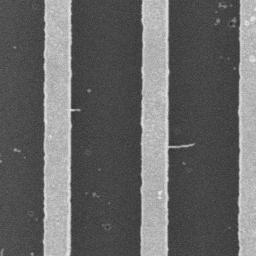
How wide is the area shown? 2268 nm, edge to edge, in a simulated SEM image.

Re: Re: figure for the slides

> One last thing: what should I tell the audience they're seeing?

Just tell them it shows lines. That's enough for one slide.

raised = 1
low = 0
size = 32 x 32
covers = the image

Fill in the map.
00000011100000000011100000000011
00000011100000000011100000000011
00000011100000000011100000000011
00000011100000000011100000000011
00000011100000000011100000000011
00000011100000000011100000000011
00000011100000000011100000000011
00000011100000000011100000000011
00000011100000000011100000000011
00000011100000000011100000000011
00000011100000000011100000000011
00000011100000000011100000000011
00000011100000000011100000000011
00000011100000000011100000000011
00000011100000000011100000000011
00000011100000000011100000000011
00000011100000000011100000000011
00000011100000000011100000000011
00000011100000000011100000000011
00000011100000000011100000000011
00000011100000000011100000000011
00000011100000000011100000000011
00000011100000000011100000000011
00000011100000000011100000000011
00000011100000000011100000000011
00000011100000000011100000000011
00000011100000000011100000000011
00000011100000000011100000000011
00000011100000000011100000000011
00000011100000000011100000000011
00000111100000000011100000000011
00000011100000000011100000000011